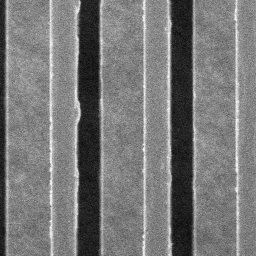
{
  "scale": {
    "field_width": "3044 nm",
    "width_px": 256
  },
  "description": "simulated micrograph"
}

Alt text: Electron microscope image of lines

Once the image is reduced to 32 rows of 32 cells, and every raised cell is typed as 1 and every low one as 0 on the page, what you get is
01111111110001111111100011111111
01111111110001111111100011111111
01111111110001111111100011111111
01111111110001111111100011111111
01111111110001111111100011111111
01111111110001111111100011111111
01111111110001111111100011111111
01111111110001111111100011111111
01111111110001111111100011111111
01111111110001111111100011111111
01111111110001111111100011111111
01111111110001111111100011111111
01111111110001111111100011111111
01111111110001111111100011111111
01111111110001111111100011111111
01111111110001111111100011111111
01111111110001111111100011111111
01111111110001111111100011111111
01111111110001111111100011111111
01111111110001111111100011111111
01111111110001111111100011111111
01111111110001111111100011111111
01111111110001111111100011111111
01111111110001111111100011111111
01111111110001111111100011111111
01111111110001111111100011111111
01111111110001111111100011111111
01111111110001111111100011111111
01111111110001111111100011111111
01111111100001111111100011111111
01111111100001111111100011111111
01111111100001111111100011111111